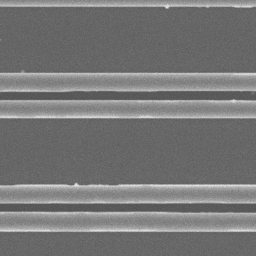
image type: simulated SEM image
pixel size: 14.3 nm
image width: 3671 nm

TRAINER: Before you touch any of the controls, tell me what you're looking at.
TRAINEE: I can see lines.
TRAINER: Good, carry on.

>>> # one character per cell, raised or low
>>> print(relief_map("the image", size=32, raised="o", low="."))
oooooooooooooooooooooooooooooooo
................................
................................
................................
................................
................................
................................
................................
................................
oooooooooooooooooooooooooooooooo
oooooooooooooooooooooooooooooooo
................................
.............................o..
oooooooooooooooooooooooooooooooo
oooooooooooooooooooooooooooooooo
................................
................................
................................
................................
................................
................................
................................
................................
oooooooooooooooooooooooooooooooo
oooooooooooooooooooooooooooooooo
................................
................................
oooooooooooooooooooooooooooooooo
oooooooooooooooooooooooooooooooo
................................
................................
................................